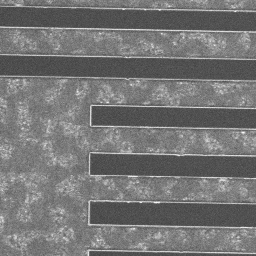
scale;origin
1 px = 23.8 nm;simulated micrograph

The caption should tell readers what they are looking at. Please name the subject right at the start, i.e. parallel lines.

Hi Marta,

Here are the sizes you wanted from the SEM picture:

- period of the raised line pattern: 1160 nm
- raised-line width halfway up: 0.518 microns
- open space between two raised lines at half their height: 631 nm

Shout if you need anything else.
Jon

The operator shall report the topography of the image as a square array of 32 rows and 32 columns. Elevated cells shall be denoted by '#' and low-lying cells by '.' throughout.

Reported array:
................................
################################
################################
........########################
................................
................................
................................
################################
################################
.###############################
................................
................................
................................
............#############.......
...........#####################
...........#####################
................................
................................
................................
...........###################..
...........#####################
...........#####################
................................
................................
................................
...........##################...
...........#####################
...........#####################
................................
................................
................................
...........##########...........